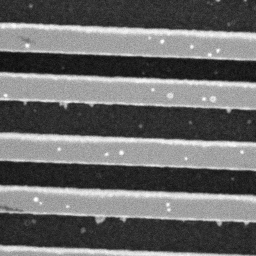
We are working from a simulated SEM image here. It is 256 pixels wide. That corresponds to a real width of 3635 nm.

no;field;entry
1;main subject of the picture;lines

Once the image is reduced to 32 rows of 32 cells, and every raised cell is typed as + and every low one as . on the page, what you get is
................................
................................
................................
+++++++++++++++.................
++++++++++++++++++++++++++++++++
++++++++++++++++++++++++++++++++
...+++++++++++++++++++++++++++++
................................
................................
+++++++++.......................
++++++++++++++++++++++++++++++++
++++++++++++++++++++++++++++++++
..++++++++++++++++++++++++++++++
...........................+++++
................................
................................
................................
+++++++++++++++++++++++.........
++++++++++++++++++++++++++++++++
++++++++++++++++++++++++++++++++
.............+++++++++++++++++++
................................
................................
+++++++.........................
++++++++++++++++++++++++++++++++
++++++++++++++++++++++++++++++++
.+++++++++++++++++++++++++++++++
.........................+++++++
................................
................................
................................
+++++++++++++++++...............